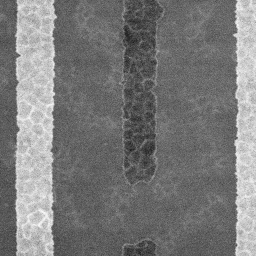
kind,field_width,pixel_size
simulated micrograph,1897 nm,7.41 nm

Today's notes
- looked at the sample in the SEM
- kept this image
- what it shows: one or a few lines or trenches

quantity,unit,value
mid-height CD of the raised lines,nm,244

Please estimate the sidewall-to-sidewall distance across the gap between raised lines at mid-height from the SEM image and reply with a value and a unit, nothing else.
546 nm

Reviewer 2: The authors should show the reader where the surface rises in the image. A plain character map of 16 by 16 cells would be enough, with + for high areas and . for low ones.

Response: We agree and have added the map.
.++.....++.....+
.++.....++.....+
.++.....++.....+
.++.....++.....+
.++.....++.....+
.++.....++.....+
.++.....++.....+
.++.....++.....+
.++.....++.....+
.++.....++.....+
.++.....++.....+
.++............+
.+++...........+
.++............+
.++............+
.++.....++.....+